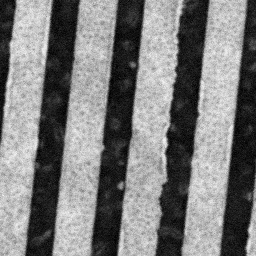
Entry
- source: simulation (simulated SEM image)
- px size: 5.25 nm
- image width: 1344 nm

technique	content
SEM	one or a few lines or trenches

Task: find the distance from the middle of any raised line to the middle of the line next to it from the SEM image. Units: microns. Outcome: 0.337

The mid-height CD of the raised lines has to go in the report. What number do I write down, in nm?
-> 190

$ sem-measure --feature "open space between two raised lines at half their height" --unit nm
150